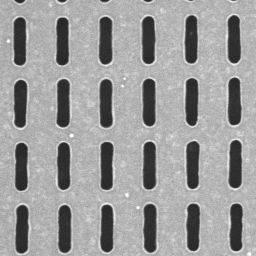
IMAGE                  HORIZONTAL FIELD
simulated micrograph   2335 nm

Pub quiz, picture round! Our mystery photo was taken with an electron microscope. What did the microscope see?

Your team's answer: a regular array of holes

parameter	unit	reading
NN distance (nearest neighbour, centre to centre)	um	0.39